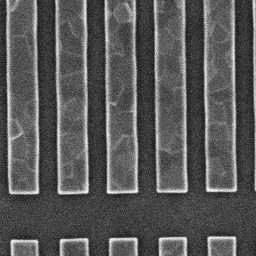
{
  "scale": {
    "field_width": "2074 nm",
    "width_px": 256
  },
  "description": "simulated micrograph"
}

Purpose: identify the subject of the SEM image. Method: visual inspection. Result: wiring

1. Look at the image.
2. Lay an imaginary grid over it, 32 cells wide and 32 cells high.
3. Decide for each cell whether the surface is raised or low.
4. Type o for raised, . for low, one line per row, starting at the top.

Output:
.ooo...oooo..oooo..oooo...ooo...
.ooo...oooo..oooo..oooo...ooo...
.ooo...oooo..oooo..oooo...ooo...
.ooo...oooo..oooo..oooo...ooo...
.ooo...oooo..oooo..oooo...ooo...
.ooo...oooo..oooo..oooo...ooo...
.ooo...oooo..oooo..oooo...ooo...
.ooo...oooo..oooo..oooo...ooo...
.ooo...oooo..oooo..oooo...ooo...
.oooo..oooo..oooo..oooo...ooo...
.oooo..oooo..oooo..oooo...ooo...
.oooo..oooo..oooo..oooo...ooo...
.oooo..oooo..oooo..oooo...ooo...
.oooo..oooo..oooo..oooo...ooo...
.oooo..oooo..oooo...ooo...ooo...
.oooo..oooo..oooo...ooo...ooo...
.oooo..oooo..oooo...ooo...ooo...
.oooo..oooo..oooo...ooo...ooo...
.oooo..oooo..oooo...ooo...ooo...
.oooo..oooo..oooo...ooo...ooo...
.oooo..oooo..oooo...ooo...ooo...
.oooo..oooo..oooo...ooo...ooo...
.oooo..oooo..oooo...ooo...ooo...
.oooo..oooo..oooo...ooo...ooo...
................................
................................
................................
................................
................................
................................
..ooo...ooo...ooo...ooo...ooo...
..ooo...ooo...ooo...ooo...ooo...